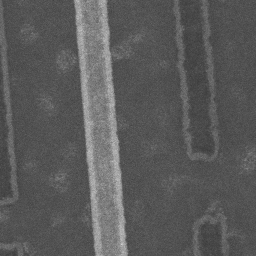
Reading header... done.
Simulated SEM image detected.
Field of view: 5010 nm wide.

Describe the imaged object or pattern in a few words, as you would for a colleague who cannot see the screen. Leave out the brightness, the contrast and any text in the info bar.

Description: one or a few lines or trenches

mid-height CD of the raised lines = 483 nanometres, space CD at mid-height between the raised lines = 1520 nanometres